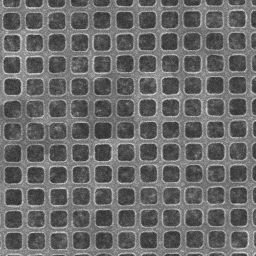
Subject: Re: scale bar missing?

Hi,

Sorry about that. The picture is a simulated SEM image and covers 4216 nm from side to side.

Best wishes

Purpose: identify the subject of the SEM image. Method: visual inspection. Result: a regular array of holes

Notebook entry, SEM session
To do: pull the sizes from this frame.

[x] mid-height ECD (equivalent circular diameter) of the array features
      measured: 308 nanometers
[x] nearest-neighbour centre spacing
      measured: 359 nanometers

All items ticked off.